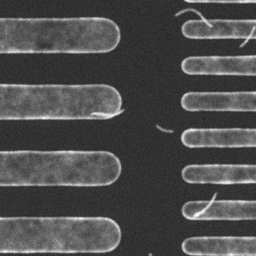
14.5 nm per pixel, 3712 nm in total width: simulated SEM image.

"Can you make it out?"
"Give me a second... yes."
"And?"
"groups of lines, slits or small figures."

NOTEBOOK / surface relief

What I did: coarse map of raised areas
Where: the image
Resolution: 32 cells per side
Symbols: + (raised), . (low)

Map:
................................
................................
++++++++++++++...........+......
+++++++++++++++........+++++++++
+++++++++++++++........+++++++++
+++++++++++++++.................
................................
.......................+++++++++
.......................+++++++++
................................
................................
+++++++++++++++.................
+++++++++++++++........+++++++++
+++++++++++++++........+++++++++
++++++++++++++..................
................................
.......................+++++++++
.......................+++++++++
................................
++++++++++++++..................
+++++++++++++++.................
+++++++++++++++........+++++++++
++++++++++++++.........+++++++++
................................
................................
.......................+++++++++
.......................+++++++++
++++++++++++++..................
+++++++++++++++.................
+++++++++++++++.................
+++++++++++++++........+++++++++
+++++.+++++++..........+++++++++